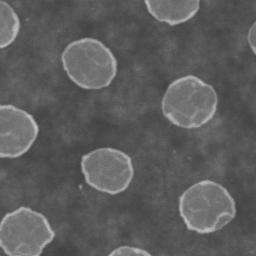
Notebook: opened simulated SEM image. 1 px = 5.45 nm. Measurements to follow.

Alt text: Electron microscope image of raised bodies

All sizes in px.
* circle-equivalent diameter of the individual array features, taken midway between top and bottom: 51.7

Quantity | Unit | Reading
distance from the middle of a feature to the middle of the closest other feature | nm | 577